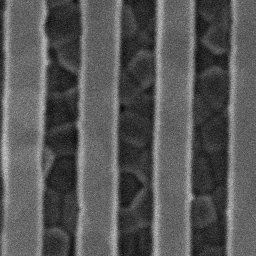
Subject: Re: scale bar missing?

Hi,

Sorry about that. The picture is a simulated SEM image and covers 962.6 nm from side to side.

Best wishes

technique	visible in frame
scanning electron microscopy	one or a few lines or trenches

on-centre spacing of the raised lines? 0.282 um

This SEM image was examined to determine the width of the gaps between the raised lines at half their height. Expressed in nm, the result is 148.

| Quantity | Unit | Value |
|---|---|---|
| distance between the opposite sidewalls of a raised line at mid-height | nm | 134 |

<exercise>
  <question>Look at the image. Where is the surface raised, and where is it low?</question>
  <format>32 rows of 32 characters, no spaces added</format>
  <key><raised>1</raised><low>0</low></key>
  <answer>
01111100001111100000111100000111
01111100001111100000111100000111
01111100001111100000111100000111
01111000001111100000111100000111
01111100001111100000111100000111
01111100001111100000111100000111
01111000001111100000111100000111
01111100001111100000111100000111
01111100001111100000111100000111
01111000001111100000111100000111
01111000001111100000111100000111
01111000001111100000111100000111
01111000001111100000111100000111
01111000001111100000111100000111
01111000001111000000111100000111
01111000001111000000111100000111
01111000001111000001111100000111
11111000001111000001111100000111
01111000001111000001111100000111
01111000001111000001111100000111
01111000001111000001111100000111
01111000001111000001111100000111
01111000001111000001111100000111
01111000001111000001111100000111
01111000001111000001111100000111
01111000001111000001111100000111
01111000001111000000111100000111
01111000001111000000111100000111
01111000001111000000111100000111
01111000001111000001111100000111
11111000001111000001111100000111
11111000001111000001111100000111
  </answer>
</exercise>